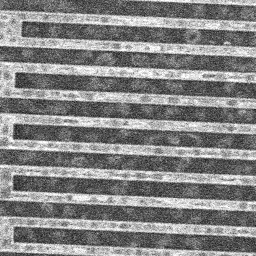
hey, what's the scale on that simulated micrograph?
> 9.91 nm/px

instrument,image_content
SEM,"parallel lines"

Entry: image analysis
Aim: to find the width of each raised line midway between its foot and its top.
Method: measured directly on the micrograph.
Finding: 85.3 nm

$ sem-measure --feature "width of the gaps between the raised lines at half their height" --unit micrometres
0.17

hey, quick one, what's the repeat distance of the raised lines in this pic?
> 254 nm